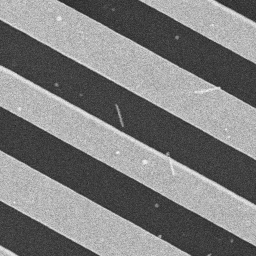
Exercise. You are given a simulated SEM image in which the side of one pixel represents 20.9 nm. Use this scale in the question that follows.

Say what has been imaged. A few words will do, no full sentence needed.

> lines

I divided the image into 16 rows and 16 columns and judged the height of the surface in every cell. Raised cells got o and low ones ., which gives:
oooo......oooo..
.ooooo.....ooooo
..oooooo.....ooo
....oooooo.....o
o.....oooooo....
ooo.....oooooo..
oooo......ooooo.
..oooo.....ooooo
...ooooo.....ooo
.....ooooo.....o
oo.....ooooo....
oooo.....ooooo..
oooooo.....oooo.
..ooooo......ooo
....ooooo.....oo
.....oooooo.....